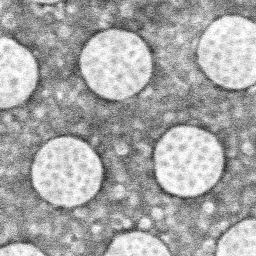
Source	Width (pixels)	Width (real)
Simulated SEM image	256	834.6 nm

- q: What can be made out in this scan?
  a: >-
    raised bodies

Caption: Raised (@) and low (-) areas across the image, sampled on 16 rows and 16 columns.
----------------
-------------@@@
@-----@@@----@@@
@@---@@@@---@@@@
@@---@@@@----@@@
@@----@@@-------
@---------------
----------------
----------@@@---
---@@@----@@@@--
--@@@@----@@@@--
--@@@@----@@@---
---@@-----------
----------------
--------------@@
@@-----@@@----@@